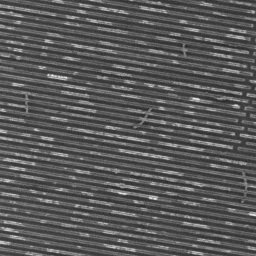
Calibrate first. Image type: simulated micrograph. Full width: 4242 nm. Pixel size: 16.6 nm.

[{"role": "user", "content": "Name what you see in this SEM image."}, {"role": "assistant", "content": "parallel lines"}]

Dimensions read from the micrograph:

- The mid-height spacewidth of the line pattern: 75.6 nm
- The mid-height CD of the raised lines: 0.045 µm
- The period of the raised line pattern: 114 nm